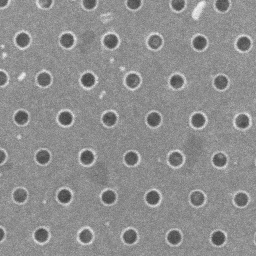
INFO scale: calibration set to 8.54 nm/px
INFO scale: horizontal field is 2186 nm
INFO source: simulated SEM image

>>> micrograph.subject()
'a regular array of holes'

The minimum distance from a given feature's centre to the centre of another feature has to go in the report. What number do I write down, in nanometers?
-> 377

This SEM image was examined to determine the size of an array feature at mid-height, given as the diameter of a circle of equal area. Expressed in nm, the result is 133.